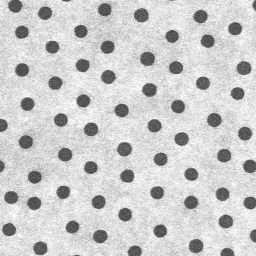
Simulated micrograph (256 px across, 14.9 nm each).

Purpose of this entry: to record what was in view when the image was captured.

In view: a regular array of holes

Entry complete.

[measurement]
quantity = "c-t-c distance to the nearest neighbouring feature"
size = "444 nm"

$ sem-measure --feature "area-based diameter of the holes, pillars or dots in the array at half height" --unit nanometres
207